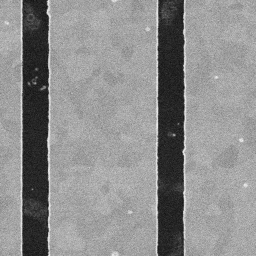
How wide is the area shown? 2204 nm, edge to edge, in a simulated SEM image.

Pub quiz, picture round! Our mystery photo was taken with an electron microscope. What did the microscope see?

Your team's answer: one or a few lines or trenches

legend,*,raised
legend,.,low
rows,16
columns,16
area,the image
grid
*..*******..****
*..*******..****
*..*******..****
*..*******..****
*..*******..****
*..*******..****
*..*******..****
*..*******..****
*..*******..****
*..*******..****
*..*******..****
*..*******..****
*..*******..****
*..*******.*****
*..*******..****
*..*******..****